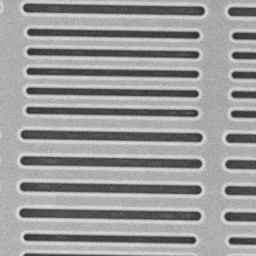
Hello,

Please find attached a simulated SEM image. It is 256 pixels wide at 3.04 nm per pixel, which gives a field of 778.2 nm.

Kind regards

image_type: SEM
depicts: groups of lines, slits or small figures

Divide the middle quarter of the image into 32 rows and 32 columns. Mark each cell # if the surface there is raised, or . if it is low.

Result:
################################
................................
................................
##################..............
################################
################################
................................
................................
##################..............
################################
...#############################
................................
................................
#############################...
################################
################################
..........######################
................................
................................
#######.........................
################################
################################
################################
................................
................................
................................
################################
################################
################################
..##############################
................................
................................